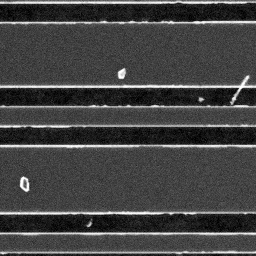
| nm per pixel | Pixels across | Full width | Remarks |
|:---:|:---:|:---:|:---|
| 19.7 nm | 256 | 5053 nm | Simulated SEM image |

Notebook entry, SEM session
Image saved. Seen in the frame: lines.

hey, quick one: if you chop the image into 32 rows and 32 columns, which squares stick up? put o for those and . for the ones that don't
................................
................................
................................
oooooooooooooooooooooooooooooooo
oooooooooooooooooooooooooooooooo
oooooooooooooooooooooooooooooooo
oooooooooooooooooooooooooooooooo
oooooooooooooooooooooooooooooooo
oooooooooooooooooooooooooooooooo
oooooooooooooooooooooooooooooooo
oooooooooooooooooooooooooooooooo
................................
................................
oooooooooooooooooooooooooooooooo
oooooooooooooooooooooooooooooooo
oooooooooooooooooooooooooooooooo
................................
................................
oooooooooooooooooooooooooooooooo
oooooooooooooooooooooooooooooooo
oooooooooooooooooooooooooooooooo
oooooooooooooooooooooooooooooooo
oooooooooooooooooooooooooooooooo
oooooooooooooooooooooooooooooooo
oooooooooooooooooooooooooooooooo
oooooooooooooooooooooooooooooooo
oooooooooooooooooooooooooooooooo
................................
................................
oooooooooooooooooooooooooooooooo
oooooooooooooooooooooooooooooooo
oooooooooooooooooooooooooooooooo